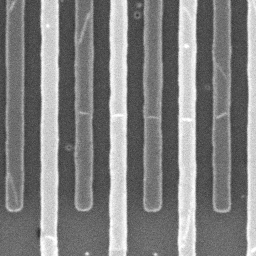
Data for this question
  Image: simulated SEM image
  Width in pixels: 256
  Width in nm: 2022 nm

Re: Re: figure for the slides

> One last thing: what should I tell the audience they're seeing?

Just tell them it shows wiring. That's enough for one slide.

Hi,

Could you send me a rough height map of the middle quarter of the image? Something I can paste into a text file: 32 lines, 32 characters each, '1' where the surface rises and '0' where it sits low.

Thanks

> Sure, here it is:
00011110000011100000111100000111
00011110000011100000111100000111
00011110000011100000111100000111
00011110000011100000111100000111
00011110000011100000111100000111
00011110000011100000111100000111
00011110000011100000111100000111
00011110000011100000111100000111
00011110000011100000111100000111
00011110000011100000111100000111
00011110000011100000111100000111
00011110000011100000111100000111
00011110000011100000111100000111
00011110000011100000111100000111
00011110000011100000111100000111
00011110000011100000111100000111
00011110000011100000111100000111
00011110000011100000111100000111
00011110000011100000111100000111
00011110000011100000111100000111
00011110000011100000111100000111
00011110000011100000111100000111
00011110000011100000111100000111
00011110000011100000111100000111
00011110000011100000111100000111
00011110000011100000111100000111
00011110000011100000111100000111
00011110000011100000111100000111
00011110000011100000111100000111
00011110000011100000111100000111
00011110000011100000111100000111
00011110000011100000111100000111